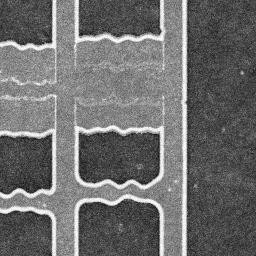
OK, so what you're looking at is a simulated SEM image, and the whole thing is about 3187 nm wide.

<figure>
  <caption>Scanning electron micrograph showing one or a few lines or trenches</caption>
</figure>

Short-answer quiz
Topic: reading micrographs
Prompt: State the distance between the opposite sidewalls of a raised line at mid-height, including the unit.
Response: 283 nanometers